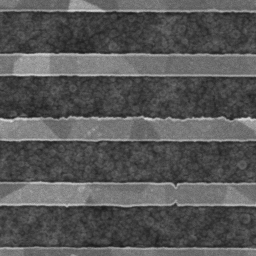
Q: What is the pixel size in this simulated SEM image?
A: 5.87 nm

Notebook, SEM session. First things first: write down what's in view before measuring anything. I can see one or a few lines or trenches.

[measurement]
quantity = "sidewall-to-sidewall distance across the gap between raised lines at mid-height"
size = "252 nm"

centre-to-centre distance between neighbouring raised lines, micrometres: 0.378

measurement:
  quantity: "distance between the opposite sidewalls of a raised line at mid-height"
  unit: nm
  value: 126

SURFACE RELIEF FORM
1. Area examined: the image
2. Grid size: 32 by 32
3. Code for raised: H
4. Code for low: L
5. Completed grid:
HHHHHHHHHHHHHHHHHHHHHHHHHHHHHHHH
LLLLLLLLLLLLLLLLLLLLLLLLLLLLLLLL
LLLLLLLLLLLLLLLLLLLLLLLLLLLLLLLL
LLLLLLLLLLLLLLLLLLLLLLLLLLLLLLLL
LLLLLLLLLLLLLLLLLLLLLLLLLLLLLLLL
LLLLLLLLLLLLLLLLLLLLLLLLLLLLLLLL
LLLLLLLLLLLLLLLLLLLLLLLLLLLLLLLL
HHHHHHHHHHHHHHHHHHHHHHHHHHHHHHHH
HHHHHHHHHHHHHHHHHHHHHHHHHHHHHHHH
LLLLLLLLLLLLLLLLLLLLLLLLLLLLLLLL
LLLLLLLLLLLLLLLLLLLLLLLLLLLLLLLL
LLLLLLLLLLLLLLLLLLLLLLLLLLLLLLLL
LLLLLLLLLLLLLLLLLLLLLLLLLLLLLLLL
LLLLLLLLLLLLLLLLLLLLLLLLLLLLLLLL
LLLLLLLLLLLLLLLLLLLLLLLLLLLLLLLL
HHHHHHHHHHHHHHHHHHHHHHHHHHHHHHHH
HHHHHHHHHHHHHHHHHHHHHHHHHHHHHHHH
LHHLLLHLLLHHHLLHHHLHLHHHHHHHLHHL
LLLLLLLLLLLLLLLLLLLLLLLLLLLLLLLL
LLLLLLLLLLLLLLLLLLLLLLLLLLLLLLLL
LLLLLLLLLLLLLLLLLLLLLLLLLLLLLLLL
LLLLLLLLLLLLLLLLLLLLLLLLLLLLLLLL
LLLLLLLLLLLLLLLLLLLLLLLLLLLLLLLL
HHHHHHHHHHHHHHHHHHHHHHHHHHHHHHHH
HHHHHHHHHHHHHHHHHHHHHHHHHHHHHHHH
HHHLHHHHHHHHHLHHHHHHHHHHHHHHHHHH
LLLLLLLLLLLLLLLLLLLLLLLLLLLLLLLL
LLLLLLLLLLLLLLLLLLLLLLLLLLLLLLLL
LLLLLLLLLLLLLLLLLLLLLLLLLLLLLLLL
LLLLLLLLLLLLLLLLLLLLLLLLLLLLLLLL
LLLLLLLLLLLLLLLLLLLLLLLLLLLLLLLL
HHHHHHHHHHHHHHHHHHHHHHHHHHHHHHHH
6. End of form